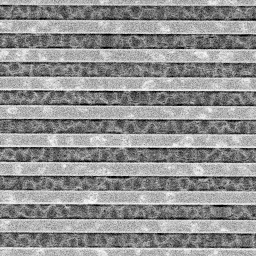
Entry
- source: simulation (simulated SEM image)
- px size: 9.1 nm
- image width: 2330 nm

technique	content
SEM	parallel lines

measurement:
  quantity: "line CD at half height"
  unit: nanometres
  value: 120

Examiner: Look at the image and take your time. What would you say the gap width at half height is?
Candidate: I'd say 135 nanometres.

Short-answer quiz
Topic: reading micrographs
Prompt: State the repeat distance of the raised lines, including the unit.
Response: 0.259 µm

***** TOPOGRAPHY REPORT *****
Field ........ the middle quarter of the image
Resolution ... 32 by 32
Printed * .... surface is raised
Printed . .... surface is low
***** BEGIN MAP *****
................................
................................
................................
***********.....................
********************************
********************************
....****************************
................................
................................
................................
*************...................
********************************
********************************
*.**..**************************
................................
................................
................................
................................
********************************
********************************
********************************
................................
................................
................................
................................
********************************
********************************
********************************
................................
................................
................................
................................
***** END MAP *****